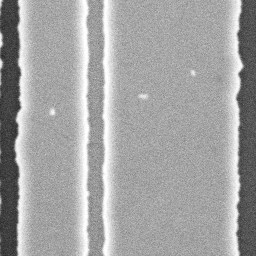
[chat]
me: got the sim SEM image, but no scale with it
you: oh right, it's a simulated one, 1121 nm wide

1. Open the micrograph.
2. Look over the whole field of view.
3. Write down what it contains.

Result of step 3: lines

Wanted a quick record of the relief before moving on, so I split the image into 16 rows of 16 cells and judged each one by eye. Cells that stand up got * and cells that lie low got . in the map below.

.**************.
.**************.
.**************.
.**************.
.**************.
.**************.
.**************.
.**************.
.**************.
.**************.
.**************.
.**************.
.**************.
.**************.
.**************.
.**************.